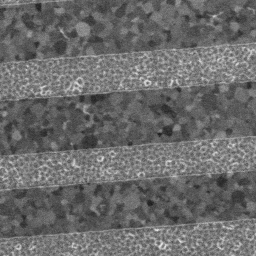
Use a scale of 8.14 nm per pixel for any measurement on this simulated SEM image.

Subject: one or a few lines or trenches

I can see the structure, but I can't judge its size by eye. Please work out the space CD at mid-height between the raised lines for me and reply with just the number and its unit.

0.269 um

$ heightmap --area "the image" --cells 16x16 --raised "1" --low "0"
1111111111111111
1111111111111111
1111111111111111
1111110000000000
0000000000000000
0000000000111111
1111111111111111
1111111111111111
1111111111111111
1111000000000000
0000000000000000
0000011111111111
1111111111111111
1111111111111111
1111110000000000
0000000000000000